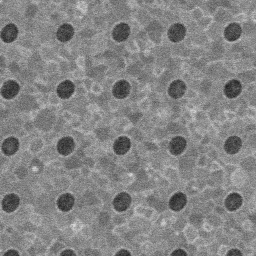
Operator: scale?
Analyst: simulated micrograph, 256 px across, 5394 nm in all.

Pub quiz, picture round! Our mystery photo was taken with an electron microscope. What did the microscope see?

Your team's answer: a regular array of holes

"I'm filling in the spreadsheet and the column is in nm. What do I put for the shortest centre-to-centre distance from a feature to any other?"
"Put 1170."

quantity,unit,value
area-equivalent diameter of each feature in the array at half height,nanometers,422